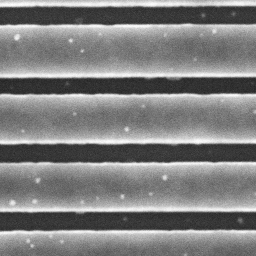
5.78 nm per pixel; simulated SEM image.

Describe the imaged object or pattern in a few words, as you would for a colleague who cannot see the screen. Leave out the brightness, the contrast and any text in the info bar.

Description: lines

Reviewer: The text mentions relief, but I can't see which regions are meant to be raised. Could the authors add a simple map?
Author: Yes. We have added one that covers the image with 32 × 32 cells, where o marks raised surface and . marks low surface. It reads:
oooooooooooooooooooooooooooooooo
................................
................................
oooooooooooooooooooooooooooooooo
oooooooooooooooooooooooooooooooo
oooooooooooooooooooooooooooooooo
oooooooooooooooooooooooooooooooo
oooooooooooooooooooooooooooooooo
oooooooooooooooooooooooooooooooo
oooooooooooooooooooooooooooooooo
................................
................................
oooooooooooooooooooooooooooooooo
oooooooooooooooooooooooooooooooo
oooooooooooooooooooooooooooooooo
oooooooooooooooooooooooooooooooo
oooooooooooooooooooooooooooooooo
oooooooooooooooooooooooooooooooo
................................
................................
oooooooooooooooooooooooooooooooo
oooooooooooooooooooooooooooooooo
oooooooooooooooooooooooooooooooo
oooooooooooooooooooooooooooooooo
oooooooooooooooooooooooooooooooo
oooooooooooooooooooooooooooooooo
...o............................
................................
................................
oooooooooooooooooooooooooooooooo
oooooooooooooooooooooooooooooooo
oooooooooooooooooooooooooooooooo